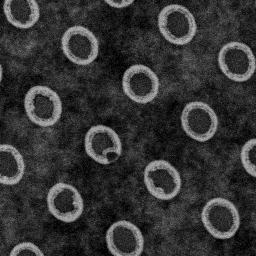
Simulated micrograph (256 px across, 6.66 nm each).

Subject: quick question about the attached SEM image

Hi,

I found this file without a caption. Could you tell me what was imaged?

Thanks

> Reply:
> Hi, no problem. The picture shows a regular array of raised bodies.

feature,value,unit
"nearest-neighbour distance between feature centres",0.465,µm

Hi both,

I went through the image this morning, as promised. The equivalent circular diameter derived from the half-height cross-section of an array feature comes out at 230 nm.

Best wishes